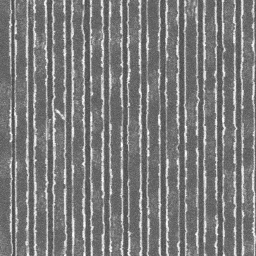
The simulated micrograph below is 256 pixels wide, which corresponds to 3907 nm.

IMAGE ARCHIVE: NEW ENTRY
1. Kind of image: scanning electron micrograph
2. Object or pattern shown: parallel lines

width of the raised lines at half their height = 196 nm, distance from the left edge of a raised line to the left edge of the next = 288 nanometres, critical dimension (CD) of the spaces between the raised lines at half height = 83.9 nanometers